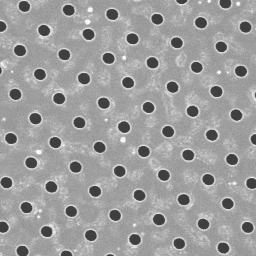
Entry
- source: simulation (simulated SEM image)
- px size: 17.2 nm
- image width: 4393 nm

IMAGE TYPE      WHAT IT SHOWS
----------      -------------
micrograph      a regular array of holes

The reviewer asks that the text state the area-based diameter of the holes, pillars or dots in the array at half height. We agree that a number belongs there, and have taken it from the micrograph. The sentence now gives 0.201 microns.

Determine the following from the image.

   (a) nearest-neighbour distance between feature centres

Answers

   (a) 534 nanometres